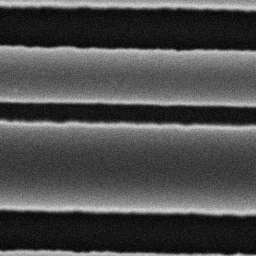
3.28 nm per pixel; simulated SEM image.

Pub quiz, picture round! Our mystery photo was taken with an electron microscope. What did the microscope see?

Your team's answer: lines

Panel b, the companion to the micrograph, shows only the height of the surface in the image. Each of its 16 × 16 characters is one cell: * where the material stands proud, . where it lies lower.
...............*
................
................
****************
****************
****************
****************
****************
****************
****************
****************
****************
****************
................
................
................